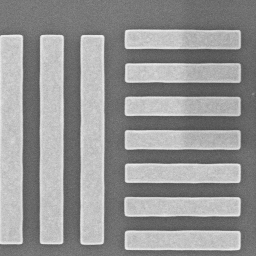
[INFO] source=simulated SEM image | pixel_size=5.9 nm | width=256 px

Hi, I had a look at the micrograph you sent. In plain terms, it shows groups of lines, slits or small figures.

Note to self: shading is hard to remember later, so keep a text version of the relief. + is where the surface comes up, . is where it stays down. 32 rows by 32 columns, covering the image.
................................
................................
................................
................................
++...+++...++...++++++++++++++..
+++..+++..+++...++++++++++++++..
+++..+++..+++...................
+++..+++..+++...................
+++..+++..+++...++++++++++++++..
+++..+++..+++...++++++++++++++..
+++..+++..+++...................
+++..+++..+++...................
+++..+++..+++...++++++++++++++..
+++..+++..+++...++++++++++++++..
+++..+++..+++...................
+++..+++..+++...................
+++..+++..+++...++++++++++++++..
+++..+++..+++...++++++++++++++..
+++..+++..+++...++++++++++++++..
+++..+++..+++...................
+++..+++..+++...................
+++..+++..+++...++++++++++++++..
+++..+++..+++...++++++++++++++..
+++..+++..+++...................
+++..+++..+++...................
+++..+++..+++...++++++++++++++..
+++..+++..+++...++++++++++++++..
+++..+++..+++...................
+++..+++..+++...................
+++..+++..+++...++++++++++++++..
...........+....++++++++++++++..
................................